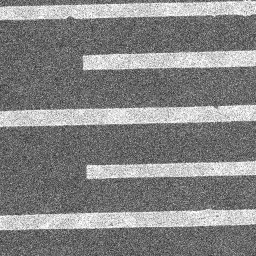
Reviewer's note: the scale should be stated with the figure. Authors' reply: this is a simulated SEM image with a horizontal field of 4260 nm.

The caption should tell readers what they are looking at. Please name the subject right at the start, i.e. parallel lines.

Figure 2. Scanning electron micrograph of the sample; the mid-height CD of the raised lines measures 239 nm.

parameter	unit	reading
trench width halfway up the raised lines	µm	0.635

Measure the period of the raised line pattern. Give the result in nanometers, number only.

872